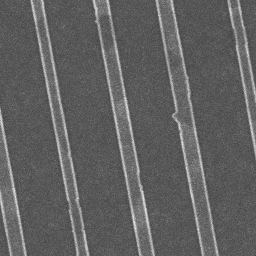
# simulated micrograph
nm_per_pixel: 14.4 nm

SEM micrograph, one or a few lines or trenches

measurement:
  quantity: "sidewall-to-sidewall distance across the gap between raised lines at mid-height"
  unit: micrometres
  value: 0.737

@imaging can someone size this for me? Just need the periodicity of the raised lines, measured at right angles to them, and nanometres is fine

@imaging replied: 912